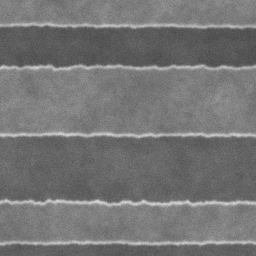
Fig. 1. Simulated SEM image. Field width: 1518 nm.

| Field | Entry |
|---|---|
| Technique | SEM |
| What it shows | lines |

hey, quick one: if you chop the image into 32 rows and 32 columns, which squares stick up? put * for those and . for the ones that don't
********************************
********************************
********************************
................................
................................
................................
................................
................................
**.****..********.**.*****.**.**
********************************
********************************
********************************
********************************
********************************
********************************
********************************
********************************
................................
................................
................................
................................
................................
................................
................................
................................
********************.***********
********************************
********************************
********************************
********************************
................................
................................